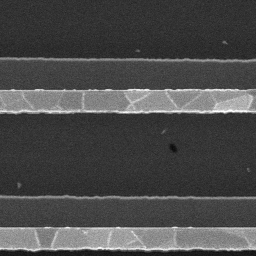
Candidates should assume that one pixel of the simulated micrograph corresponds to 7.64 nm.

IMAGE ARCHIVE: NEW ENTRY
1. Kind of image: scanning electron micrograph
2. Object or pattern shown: lines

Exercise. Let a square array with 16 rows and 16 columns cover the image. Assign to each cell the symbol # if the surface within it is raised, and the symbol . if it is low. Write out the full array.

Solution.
................
................
................
................
################
################
################
................
................
................
................
................
################
################
################
################